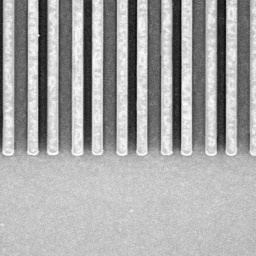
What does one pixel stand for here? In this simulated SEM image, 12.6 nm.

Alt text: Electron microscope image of parallel lines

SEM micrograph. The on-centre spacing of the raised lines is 280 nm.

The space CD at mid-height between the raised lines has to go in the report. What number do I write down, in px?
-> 13.5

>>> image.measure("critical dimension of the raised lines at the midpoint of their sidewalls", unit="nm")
134